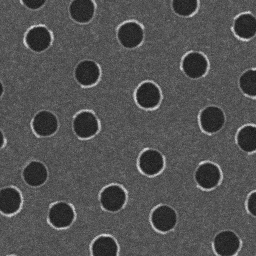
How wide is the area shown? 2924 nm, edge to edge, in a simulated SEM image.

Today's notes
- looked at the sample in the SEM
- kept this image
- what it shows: a regular array of holes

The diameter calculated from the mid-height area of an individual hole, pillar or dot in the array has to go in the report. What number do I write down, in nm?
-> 294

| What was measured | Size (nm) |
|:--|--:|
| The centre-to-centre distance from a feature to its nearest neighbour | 615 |